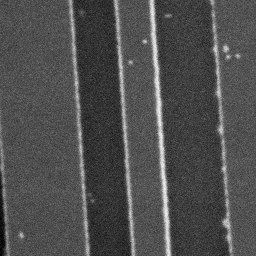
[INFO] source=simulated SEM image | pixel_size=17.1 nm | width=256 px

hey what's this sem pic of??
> lines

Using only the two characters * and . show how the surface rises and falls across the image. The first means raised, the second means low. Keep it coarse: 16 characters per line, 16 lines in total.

****...***...***
*****..***...***
*****..***...***
*****..***...***
*****...**....**
*****...**....**
*****...**....**
*****...**....**
*****...**....**
*****...**....**
*****...**....**
*****...**....**
*****...**....**
*****...**....**
*****...***...**
*****...***...**